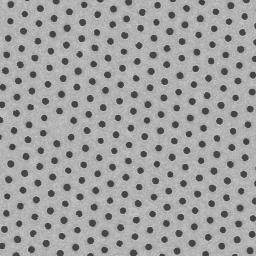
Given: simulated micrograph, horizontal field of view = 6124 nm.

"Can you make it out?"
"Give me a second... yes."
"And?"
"a regular array of holes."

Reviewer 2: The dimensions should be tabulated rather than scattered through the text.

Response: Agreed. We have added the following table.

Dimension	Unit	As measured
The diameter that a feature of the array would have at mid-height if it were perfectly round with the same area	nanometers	164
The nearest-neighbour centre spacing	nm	382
